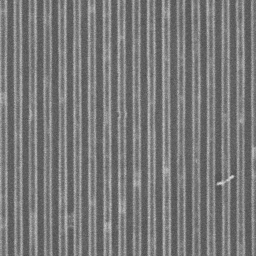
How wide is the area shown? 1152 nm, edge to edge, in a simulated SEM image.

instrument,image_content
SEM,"parallel lines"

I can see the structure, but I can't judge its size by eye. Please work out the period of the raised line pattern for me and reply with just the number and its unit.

66.8 nm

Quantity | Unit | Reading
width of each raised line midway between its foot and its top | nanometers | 31.5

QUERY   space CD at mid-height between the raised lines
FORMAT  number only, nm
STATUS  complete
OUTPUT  35.4